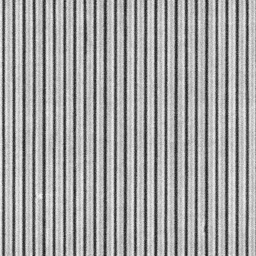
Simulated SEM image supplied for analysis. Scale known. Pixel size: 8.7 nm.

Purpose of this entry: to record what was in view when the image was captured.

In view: parallel lines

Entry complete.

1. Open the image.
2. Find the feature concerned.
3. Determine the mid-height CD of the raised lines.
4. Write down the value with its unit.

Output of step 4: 0.0533 µm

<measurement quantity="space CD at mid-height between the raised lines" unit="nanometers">38.1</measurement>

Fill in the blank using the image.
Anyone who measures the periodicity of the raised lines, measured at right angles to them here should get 88.2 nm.